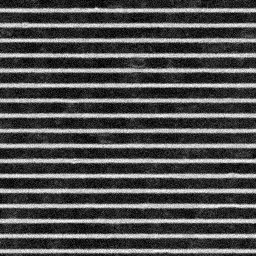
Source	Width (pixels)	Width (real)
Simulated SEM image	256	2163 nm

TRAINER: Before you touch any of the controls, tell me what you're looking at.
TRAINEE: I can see parallel lines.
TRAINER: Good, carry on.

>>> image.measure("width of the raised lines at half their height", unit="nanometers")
20.1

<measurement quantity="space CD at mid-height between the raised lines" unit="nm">104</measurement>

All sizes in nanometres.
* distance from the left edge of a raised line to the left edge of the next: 127